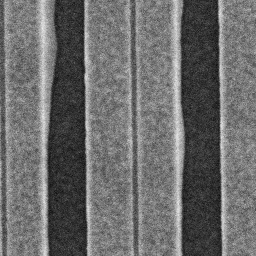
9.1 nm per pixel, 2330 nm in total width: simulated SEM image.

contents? lines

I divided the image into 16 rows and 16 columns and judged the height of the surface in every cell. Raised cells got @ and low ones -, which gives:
@@@--@@@@@@---@@
@@@--@@@@@@---@@
@@@--@@@@@@---@@
@@@--@@@@@@---@@
@@@--@@@@@@---@@
@@@--@@@@@@---@@
@@@--@@@@@@---@@
@@@--@@@@@@---@@
@@@--@@@@@@---@@
@@@--@@@@@@---@@
@@@--@@@@@@---@@
@@@--@@@@@@---@@
@@@--@@@@@@---@@
@@@--@@@@@@---@@
@@@--@@@@@@---@@
@@@--@@@@@@---@@